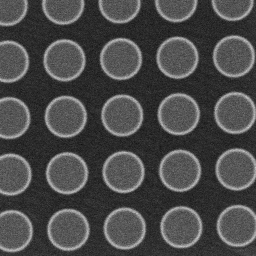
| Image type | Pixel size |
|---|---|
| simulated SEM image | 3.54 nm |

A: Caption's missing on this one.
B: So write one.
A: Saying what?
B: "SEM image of an array of small figures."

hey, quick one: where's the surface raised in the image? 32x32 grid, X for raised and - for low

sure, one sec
XXX--XXXXX--XXXXX--XXXXXX--XXXXX
XXX---XXXX---XXXX---XXXX---XXXX-
XXX---XXX-----XX-----XX-----XX--
--------------------------------
-----------------------------X--
XX----XXXX---XXXX---XXXX---XXXX-
XXX---XXXX---XXXX---XXXXX--XXXXX
XXXX-XXXXXX--XXXXX--XXXXX--XXXXX
XXXX--XXXX---XXXX---XXXX---XXXX-
XXX---XXXX----XXX----XX-----XX--
--------------------------------
--------------------------------
XX-----XXX----XXX---XXXX---XXXX-
XXX---XXXXX--XXXXX--XXXXX--XXXXX
XXXX--XXXXX--XXXXX--XXXXX--XXXXX
XXXX--XXXXX--XXXXX--XXXXX--XXXXX
XXX---XXXX----XXX----XXX----XX--
--------------------------------
--------------------------------
XX-----XXX----XXX----XXX----XXX-
XXXX--XXXXX--XXXXX--XXXXX--XXXXX
XXXX--XXXXX--XXXXX--XXXXX--XXXXX
XXXX--XXXXX--XXXXX--XXXXX--XXXXX
XXX----XXX----XXX----XXX----XXX-
--------------------------------
--------------------------------
XX-----XXX----XXX----XXX----XXXX
XXXX--XXXXX--XXXXX--XXXXX--XXXXX
XXXX--XXXXX--XXXXX--XXXXX--XXXXX
XXXX--XXXXX--XXXXX--XXXXX--XXXXX
XXXX---XXX----XXX----XXX----XXX-
--------------------------------